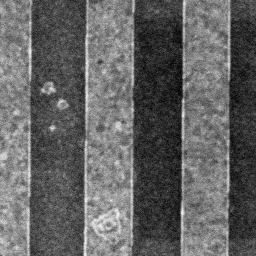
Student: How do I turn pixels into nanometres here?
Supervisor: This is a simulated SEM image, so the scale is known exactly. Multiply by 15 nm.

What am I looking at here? lines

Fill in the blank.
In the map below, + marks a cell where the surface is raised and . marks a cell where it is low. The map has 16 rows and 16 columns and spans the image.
++...+++...+++..
++...+++...+++..
++...+++...+++..
++...+++...+++..
++...+++...+++..
++...+++...+++..
++...+++...+++..
++...+++...+++..
++...+++...+++..
++...+++...+++..
++...+++...+++..
++...+++...+++..
++...+++...+++..
++...+++...+++..
++...+++...+++..
++...+++...+++..